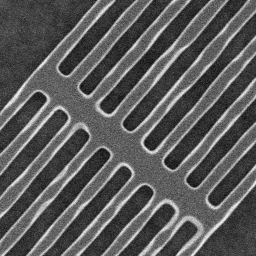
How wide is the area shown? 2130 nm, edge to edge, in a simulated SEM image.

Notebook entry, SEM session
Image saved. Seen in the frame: groups of lines, slits or small figures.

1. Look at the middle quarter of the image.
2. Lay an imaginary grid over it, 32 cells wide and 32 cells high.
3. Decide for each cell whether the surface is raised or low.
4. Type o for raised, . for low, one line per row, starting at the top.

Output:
...ooooo.....oooo.....oooo......
...oooo.....oooo......ooo......o
.ooooo.....oooo......ooo......oo
ooooo.....oooo......oooo.....ooo
oooo.....ooooo.....oooo.....oooo
oooo....ooooo.....oooo......oooo
oooo....oooo.....ooooo.....oooo.
ooooo..oooo.....oooo......oooo..
oooooooooo.....ooooo.....oooo...
ooooooooo.....ooooo.....oooo....
oooooooo......oooo.....oooo.....
ooooooooo....oooo.....oooo......
.ooooooooo..oooo......ooo......o
.oooooooooooooo......ooo......oo
.oooooooooooooo.....oooo.....ooo
ooo..oooooooooo....oooo.....oooo
ooo...oooooooooo..oooo.....oooo.
oo....ooooooooooooooo......ooo..
o.....oooooooooooooo.....ooooo..
......oooooooooooooo.....oooo...
.....ooooooooooooooo....oooo....
....oooo...oooooooooo..oooo.....
...oooo.....oooooooooooooo......
..oooo.....oooooooooooooo......o
..ooo......oooooooooooooo.....oo
.ooo......oooo..ooooooooo....ooo
oooo.....oooo....ooooooooooooooo
ooo.....oooo.....oooooooooooooo.
oo.....oooo......oooooooooooooo.
o.....ooooo.....ooooooooooooooo.
......oooo.....oooo..oooooooooo.
.....oooo.....oooo....oooooooooo